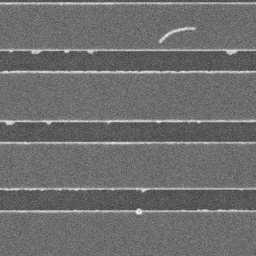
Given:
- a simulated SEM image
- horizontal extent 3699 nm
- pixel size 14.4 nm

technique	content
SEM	lines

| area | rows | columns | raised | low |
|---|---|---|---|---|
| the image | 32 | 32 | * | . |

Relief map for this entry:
********************************
********************************
********************************
********************************
********************************
********************************
................................
................................
................................
********************************
********************************
********************************
********************************
********************************
********************************
................................
................................
................................
********************************
********************************
********************************
********************************
********************************
********************************
................................
................................
********************************
********************************
********************************
********************************
********************************
********************************